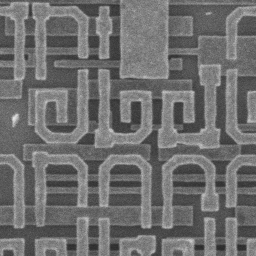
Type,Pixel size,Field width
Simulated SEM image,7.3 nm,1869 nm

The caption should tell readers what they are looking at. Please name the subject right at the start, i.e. wiring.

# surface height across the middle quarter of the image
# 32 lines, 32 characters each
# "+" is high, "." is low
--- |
..............++++++++++++......
.....+...++...++++++++++++......
....++...++...++++++++++++......
....++...++...+...++++++++......
....++...++.....................
....++...++.....................
...+++...++.....................
+..+++...++...++++++++...+++++++
+..+++...++...++++++++...+++++++
+..+++...++...+++..+++...+++..++
+..+++...++...+++..+++...++...++
+..+++...++...+++..+++...++...++
+..+++...++...+++..+++...++...++
+...++...++...+++..+++...++...++
+...++...++....+...+++..+++...++
...+++...++........+++...++.....
...+++..++++.......+++..++++....
+++++...+++++++++++++...++++++++
++++....++++++++++++....++++++++
+++.....+++++++++++.....++++++++
........++++............++++....
................................
................................
++++.......+++++++++.......+++++
+++++.....+++++++++++.....++++++
..++++...+++......++++...+++....
...+++...++........+++...++.....
....++...++........+++...++.....
....++...++........+++...++.....
....++...++........+++...++.....
....++...++........+++...++.....
....++...++........+++...++.....